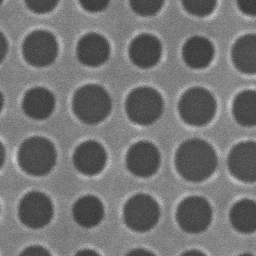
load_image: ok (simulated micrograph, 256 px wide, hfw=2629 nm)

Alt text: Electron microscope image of a regular array of holes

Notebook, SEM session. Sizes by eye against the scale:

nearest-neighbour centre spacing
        540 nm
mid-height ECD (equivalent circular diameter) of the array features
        409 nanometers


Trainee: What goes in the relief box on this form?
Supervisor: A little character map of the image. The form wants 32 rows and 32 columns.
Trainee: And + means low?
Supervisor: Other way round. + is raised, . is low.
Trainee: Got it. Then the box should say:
+++....+++....++.....++....++...
++++...++++..++++...+++....+++..
++++++++++++++++++++++++++++++++
++++++++++++++++++++++++++++++++
.++....+++...++++...++++..++++..
.++....+++....++....+++....++...
.++.....+.....++....+++....++...
.++....+++....++....+++....++...
++++..+++++.+++++..+++++..+++...
++++++++++++++++++++++++++++++++
++++++++++..++++++++++++++++++++
+++....++.....++....+++...++++..
.++....++.....++.....+.....++...
.++....++.....++.....+.....++...
+++...+++.....++....++.....++...
+++++++++++.+++++..++++...++++..
++++++++++++++++++++++++++++++++
+++...+++++.+++++.+++++...+++++.
.+.....++....+++....++.....++...
.+.....++.....++....++.....+....
.+.....++....+++....++.....+....
+++...++++...+++....++.....+....
+++++++++++++++++++++++...+++...
++++++++++++++++++++++++++++++++
+++...++++..++++...++++..+++++++
++.....++....++.....++....+++...
++.....++....++.....++.....++...
++.....++....++.....++.....++...
+++...++++..++++...+++....+++...
++++++++++++++++++++++++++++++++
++++.+++++++++++++++++++++++++++
++....++++..++++...++++...++++++